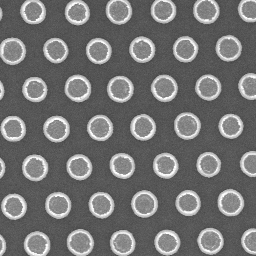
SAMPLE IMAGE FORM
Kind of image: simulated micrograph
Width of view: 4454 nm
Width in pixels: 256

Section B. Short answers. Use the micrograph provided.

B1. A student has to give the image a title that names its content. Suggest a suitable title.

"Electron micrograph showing a regular array of raised bodies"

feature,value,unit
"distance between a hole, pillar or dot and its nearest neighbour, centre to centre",43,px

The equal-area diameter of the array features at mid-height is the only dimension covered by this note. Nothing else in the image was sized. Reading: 410 nm